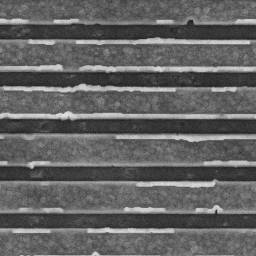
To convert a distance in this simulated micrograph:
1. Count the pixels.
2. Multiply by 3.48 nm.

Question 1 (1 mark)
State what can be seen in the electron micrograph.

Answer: parallel lines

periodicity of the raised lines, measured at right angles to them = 165 nm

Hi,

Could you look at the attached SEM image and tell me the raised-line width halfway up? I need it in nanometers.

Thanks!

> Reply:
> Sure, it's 111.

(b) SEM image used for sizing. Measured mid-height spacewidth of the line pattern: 53.9 nanometres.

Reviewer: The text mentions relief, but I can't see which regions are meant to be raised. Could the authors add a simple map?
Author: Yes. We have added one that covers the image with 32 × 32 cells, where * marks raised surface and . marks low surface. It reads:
********************************
********************************
********************************
................................
................................
********************************
********************************
********************************
********************************
................................
................................
********************************
********************************
********************************
********************************
................................
................................
********************************
********************************
********************************
********************************
................................
................................
********************************
********************************
********************************
********************************
................................
.............*..*...............
********************************
********************************
********************************